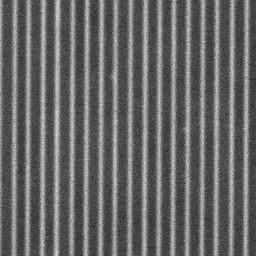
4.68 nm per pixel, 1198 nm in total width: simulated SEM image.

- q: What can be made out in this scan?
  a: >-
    parallel lines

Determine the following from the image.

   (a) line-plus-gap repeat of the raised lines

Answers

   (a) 67.8 nanometres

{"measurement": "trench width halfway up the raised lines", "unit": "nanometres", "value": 56.2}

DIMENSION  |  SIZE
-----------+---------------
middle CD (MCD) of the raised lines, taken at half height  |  0.0117 micrometres